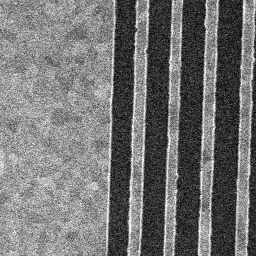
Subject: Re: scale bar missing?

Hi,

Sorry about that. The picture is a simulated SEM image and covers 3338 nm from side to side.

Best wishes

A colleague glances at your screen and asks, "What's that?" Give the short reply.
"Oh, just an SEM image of parallel lines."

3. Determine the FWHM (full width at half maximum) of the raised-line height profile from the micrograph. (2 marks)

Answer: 132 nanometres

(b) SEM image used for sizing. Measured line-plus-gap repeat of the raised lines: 463 nanometres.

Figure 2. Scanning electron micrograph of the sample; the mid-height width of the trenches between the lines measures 327 nanometers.